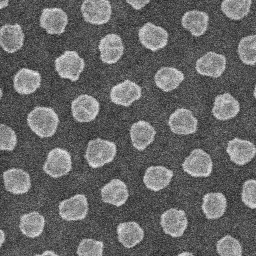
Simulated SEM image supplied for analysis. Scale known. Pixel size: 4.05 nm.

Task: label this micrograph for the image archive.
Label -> a regular array of raised bodies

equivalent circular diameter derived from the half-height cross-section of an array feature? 104 nm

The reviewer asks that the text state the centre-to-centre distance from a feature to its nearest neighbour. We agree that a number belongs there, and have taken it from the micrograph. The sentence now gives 43.4 pixels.